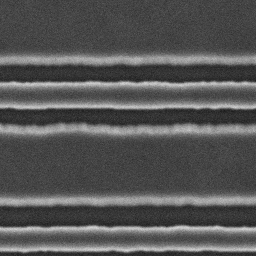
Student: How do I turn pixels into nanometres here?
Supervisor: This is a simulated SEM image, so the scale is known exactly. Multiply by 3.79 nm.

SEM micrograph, lines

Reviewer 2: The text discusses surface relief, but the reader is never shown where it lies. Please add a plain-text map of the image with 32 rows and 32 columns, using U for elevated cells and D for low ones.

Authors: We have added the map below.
UUUUUUUUUUUUUUUUUUUUUUUUUUUUUUUU
UUUUUUUUUUUUUUUUUUUUUUUUUUUUUUUU
UUUUUUUUUUUUUUUUUUUUUUUUUUUUUUUU
UUUUUUUUUUUUUUUUUUUUUUUUUUUUUUUU
UUUUUUUUUUUUUUUUUUUUUUUUUUUUUUUU
UUUUUUUUUUUUUUUUUUUUUUUUUUUUUUUU
UUUUUUUUUUUUUUUUUUUUUUUUUUUUUUUU
UUUUUUUUUUUUUUUUUUUUUUUUUUUUUUUU
DDDDDDDDDDDDDDDDDDDDDDDDDDDDDDDD
DDDDDDDDDDDDDDDDDDDDDDDDDDDDDDDD
UUUUUUUUUUUUUUUUUUUUUUUUUUUUUUUU
UUUUUUUUUUUUUUUUUUUUUUUUUUUUUUUU
UUUUUUUUUUUUUUUUUUUUUUUUUUUUUUUU
DDUUUUDDDDDDDDUUUUUUDDDDUDUUDUUU
DDDDDDDDDDDDDDDDDDDDDDDDDDDDDDDD
DDDDDDDDDDDDDDDDDDDDDDDDDDDDDDDD
UUUUUUUUUUUUUUUUUUUUUUUUUUUUUUUU
UUUUUUUUUUUUUUUUUUUUUUUUUUUUUUUU
UUUUUUUUUUUUUUUUUUUUUUUUUUUUUUUU
UUUUUUUUUUUUUUUUUUUUUUUUUUUUUUUU
UUUUUUUUUUUUUUUUUUUUUUUUUUUUUUUU
UUUUUUUUUUUUUUUUUUUUUUUUUUUUUUUU
UUUUUUUUUUUUUUUUUUUUUUUUUUUUUUUU
UUUUUUUUUUUUUUUUUUUUUUUUUUUUUUUU
UUUUUUUUUUUUUUUUUUUUUUUUUUUUUUUU
DDDDDDDDDDDDDDDDDDDDDDDDDDDDDDDD
DDDDDDDDDDDDDDDDDDDDDDDDDDDDDDDD
DDDDDDDDDDDDDDDDDDDDDDDDDDDDDDDD
DDDUUDUUUUUUUUUUUUDDDUUUUUUUDDDD
UUUUUUUUUUUUUUUUUUUUUUUUUUUUUUUU
UUUUUUUUUUUUUUUUUUUUUUUUUUUUUUUU
DDDDDDDDDDDDDDDDDDDDDDDDDDDDDDDD